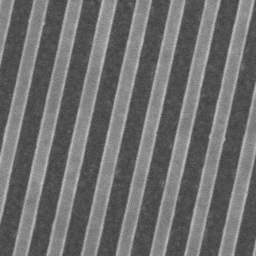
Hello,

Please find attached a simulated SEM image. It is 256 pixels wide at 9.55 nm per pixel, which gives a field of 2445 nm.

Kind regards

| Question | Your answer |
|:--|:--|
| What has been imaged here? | parallel lines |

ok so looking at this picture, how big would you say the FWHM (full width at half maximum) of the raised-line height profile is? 140 nm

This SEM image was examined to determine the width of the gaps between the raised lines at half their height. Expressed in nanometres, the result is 183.